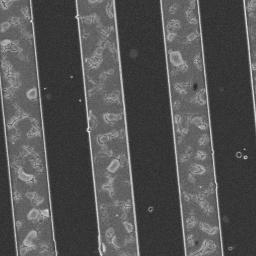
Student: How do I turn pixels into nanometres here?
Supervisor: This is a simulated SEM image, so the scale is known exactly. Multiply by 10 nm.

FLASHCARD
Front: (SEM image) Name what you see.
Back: one or a few lines or trenches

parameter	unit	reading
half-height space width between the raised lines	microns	0.371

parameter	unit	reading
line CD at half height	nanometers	471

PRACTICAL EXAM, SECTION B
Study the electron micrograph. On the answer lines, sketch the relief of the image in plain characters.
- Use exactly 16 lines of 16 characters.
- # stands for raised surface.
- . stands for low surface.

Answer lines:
..###..###..###.
..###..###..###.
..###..###...###
..###..####..###
..###...###..###
..###...###..###
...##...###..###
...###..###..###
...###..###..###
...###..###..###
#..###..###..###
#..###..###..###
#..###..###...##
#..###..###...##
#..###...##...##
#..###...###..##